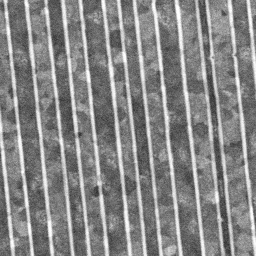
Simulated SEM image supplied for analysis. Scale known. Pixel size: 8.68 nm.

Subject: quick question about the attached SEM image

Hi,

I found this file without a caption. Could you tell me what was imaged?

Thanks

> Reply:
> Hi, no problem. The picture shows parallel lines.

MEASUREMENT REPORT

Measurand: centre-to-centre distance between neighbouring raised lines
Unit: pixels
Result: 36.5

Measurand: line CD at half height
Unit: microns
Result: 0.171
